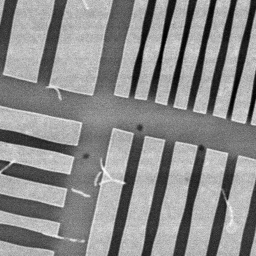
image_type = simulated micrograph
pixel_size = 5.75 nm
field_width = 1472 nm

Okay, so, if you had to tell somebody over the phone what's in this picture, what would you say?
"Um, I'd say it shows groups of lines, slits or small figures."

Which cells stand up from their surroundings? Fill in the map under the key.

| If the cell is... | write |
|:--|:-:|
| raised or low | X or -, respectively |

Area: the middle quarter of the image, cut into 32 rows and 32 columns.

XXXXXXXXX-----XXX--XXXX--XXX-XXX
XXXXXXXX------XXX--XXXX-XXXX-XXX
XXXXXXXX------XXX--XXX--XXX--XXX
XXXXXXXX-----XXXX--XXX--XXX--XXX
XXXXXXXX-----XXXX--XXX--XXX--XXX
XXXXXXXX-----XXXX-XXX---XXX--XXX
XXXXXXX------XXX--XXX--XXX--XXXX
------X------XXX--XXX--XXX--XXX-
------------------XXX--XXX--XXX-
-----------------------XXX--XXX-
----------------------------XXX-
--------------------------------
--------------------------------
--------------------------------
XXXX----------------------------
XXXX----------------------------
XXXX--------XX------------------
XXXX--------XXXXX---------------
XXXX--------XXXXX---XX----------
XXXX-------XXXXXX---XXXXX-------
-----------XXXXXX---XXXXX---XXXX
-----------XXXXX----XXXXX---XXXX
-----------XXXXX---XXXXX---XXXXX
XX---------XXXXX---XXXXX---XXXXX
XX---------XXXXX---XXXXX---XXXXX
XX--------XXXXX----XXXXX---XXXXX
XX--------XXXXX----XXXXX--XXXXXX
----------XXXXX---XXXXX---XXXXXX
----------XXXXX---XXXXX---XXXXXX
---------XXXXXX---XXXXX---XXXXX-
---------XXXXXX--XXXXXX---XXXXX-
X--------XXXXX---XXXXX----XXXXX-